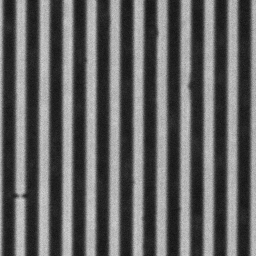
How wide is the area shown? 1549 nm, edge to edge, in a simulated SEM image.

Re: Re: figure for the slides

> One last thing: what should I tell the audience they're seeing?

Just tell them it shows parallel lines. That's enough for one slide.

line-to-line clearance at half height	77.1	nm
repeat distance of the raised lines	142	nm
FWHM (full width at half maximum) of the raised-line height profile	0.0666	microns